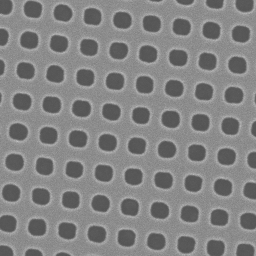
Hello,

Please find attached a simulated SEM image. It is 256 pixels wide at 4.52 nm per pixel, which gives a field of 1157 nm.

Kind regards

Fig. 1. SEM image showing a regular array of holes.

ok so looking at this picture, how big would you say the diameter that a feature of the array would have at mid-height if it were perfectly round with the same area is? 83.6 nm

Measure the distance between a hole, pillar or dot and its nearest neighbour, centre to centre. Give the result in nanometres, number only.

135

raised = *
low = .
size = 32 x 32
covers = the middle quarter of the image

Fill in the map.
****************************..**
****..**************************
***.....***...******************
***.....***....***....**********
***.....**.....***....****...***
****...****....***....***.....**
*************.****....***.....**
**************************....**
********************************
**....**************************
**.....***....******************
**.....**.....***....***********
**....****....***.....***....***
**********....***....***.....***
******************...***.....***
*************************....***
***.****************************
**....****.*********************
*.....***....****..*************
*.....***....***.....***...*****
**...****....***.....**.....****
**********...***....***.....***.
*****************...****....***.
*************************.*****.
*...****************************
.....***....********************
.....***....****...*************
.....***....***.....***....*****
***.****....***.....***....***..
***************....****....***..
***********************....***..
*******************************.